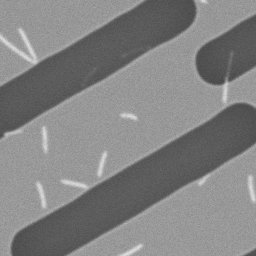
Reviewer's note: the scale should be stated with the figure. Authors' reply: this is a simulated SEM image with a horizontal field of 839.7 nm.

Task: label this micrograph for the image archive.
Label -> groups of lines, slits or small figures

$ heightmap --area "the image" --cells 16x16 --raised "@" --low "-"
@@@@@@@@----@@@@
@@@@@@@-----@@@-
@@@@@------@@---
@@@------@@@----
@@-----@@@@@---@
------@@@@@@@@@@
----@@@@@@@@@@@@
--@@@@@@@@@@@---
@@@@@@@@@@@-----
@@@@@@@@@@-----@
@@@@@@@@------@@
@@@@@@------@@@@
@@@@@-----@@@@@@
@@@------@@@@@@@
@------@@@@@@@@@
@----@@@@@@@@@@@